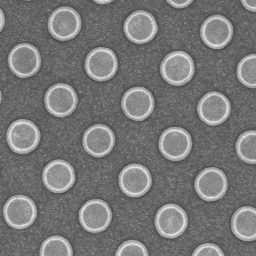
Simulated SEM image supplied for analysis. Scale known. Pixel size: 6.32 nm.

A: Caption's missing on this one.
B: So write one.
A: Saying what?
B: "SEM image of a regular array of raised bodies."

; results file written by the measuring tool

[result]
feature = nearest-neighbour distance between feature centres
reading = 0.338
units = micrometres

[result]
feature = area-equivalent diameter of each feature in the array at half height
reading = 194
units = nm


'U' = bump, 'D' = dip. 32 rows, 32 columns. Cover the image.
DDDDDDDDDDDDDDDDDDDDDUUDDDDDDDDU
DDDDDDDUUDDDDDDDDDDDDDDDDDDDDDDD
DDDDDDUUUUDDDDDDUUUDDDDDDDUUDDDD
DDDDDDUUUUDDDDDDUUUDDDDDDUUUUDDD
DDDDDDDUUDDDDDDDUUUDDDDDDUUUUDDD
DDDDDDDDDDDDDDDDDDDDDDDDDDUUDDDD
DDUUUDDDDDDDUUDDDDDDDDDDDDDDDDDD
DUUUUDDDDDDUUUDDDDDDDUUUDDDDDDUU
DUUUUDDDDDDUUUDDDDDDUUUUDDDDDDUU
DDDDDDDDDDDUUUDDDDDDDUUUDDDDDDUU
DDDDDDDDDDDDDDDDDDDDDDDDDDDDDDDU
DDDDDDUUUDDDDDDDUUDDDDDDDDDDDDDD
DDDDDDUUUDDDDDDUUUUDDDDDDUUUDDDD
DDDDDDUUUDDDDDDUUUUDDDDDDUUUUDDD
DDDDDDDDDDDDDDDDUUDDDDDDDUUUDDDD
DDUUDDDDDDDDDDDDDDDDDDDDDDDDDDDD
DUUUUDDDDDDUUUDDDDDDDUUDDDDDDDDD
DUUUUDDDDDDUUUDDDDDDUUUUDDDDDDUU
DDUUDDDDDDDUUUDDDDDDUUUUDDDDDDUU
DDDDDDDDDDDDDDDDDDDDDUUDDDDDDDUU
DDDDDDUUDDDDDDDDDDDDDDDDDDDDDDDD
DDDDDDUUUDDDDDDUUUDDDDDDDUUUDDDD
DDDDDDUUUDDDDDDUUUUDDDDDDUUUDDDD
DDDDDDUUDDDDDDDUUUDDDDDDDUUUDDDD
DDDDDDDDDDDDDDDDDDDDDDDDDUUUDDDD
DUUUDDDDDDDUUDDDDDDDDDDDDDDDDDDD
DUUUDDDDDDUUUUDDDDDDUUUDDDDDDDUU
DUUUDDDDDDUUUUDDDDDDUUUDDDDDDUUU
DDDDDDDDDDDUUDDDDDDDUUUDDDDDDUUU
DDDDDDDDDDDDDDDDDDDDDUDDDDDDDDUU
DDDDDDUUDDDDDDDDUDDDDDDDDDDDDDDD
DDDDDUUUUDDDDDDUUUDDDDDDUUUUDDDD